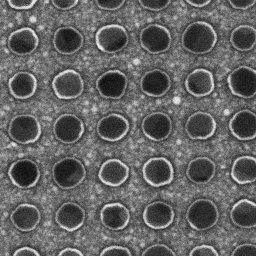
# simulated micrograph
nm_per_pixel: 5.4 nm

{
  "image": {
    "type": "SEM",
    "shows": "a regular array of raised bodies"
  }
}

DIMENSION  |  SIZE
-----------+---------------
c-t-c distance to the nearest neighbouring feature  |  235 nm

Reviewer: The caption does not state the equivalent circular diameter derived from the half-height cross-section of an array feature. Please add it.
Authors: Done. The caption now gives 0.156 microns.